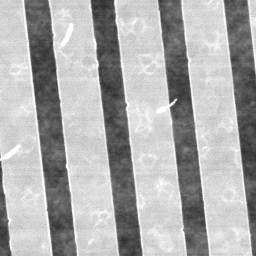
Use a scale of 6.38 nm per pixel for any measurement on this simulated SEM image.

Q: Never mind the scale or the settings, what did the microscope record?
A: one or a few lines or trenches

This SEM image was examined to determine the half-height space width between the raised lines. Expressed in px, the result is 24.6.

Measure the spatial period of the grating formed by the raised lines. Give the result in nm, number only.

421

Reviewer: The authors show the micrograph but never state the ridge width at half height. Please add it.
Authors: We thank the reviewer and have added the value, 263 nm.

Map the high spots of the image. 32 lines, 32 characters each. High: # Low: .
###...#####...######...#####...#
###...#####....#####...#####...#
###...######...#####...#####...#
###....#####...#####...#####...#
###....#####...#####...#####....
####...#####...#####...######...
####...#####...#####...######...
####...#####...#####....#####...
####...#####...######...#####...
####...#####...######...#####...
####...#####....#####...#####...
####...######...#####...#####...
####....#####...#####...#####...
####....#####...#####...#####...
####....#####...#####...######..
#####...#####...#####...######..
#####...#####...#####....#####..
#####...#####...######...#####..
#####...#####...######...#####..
#####...#####....#####...#####..
#####...######...#####...#####..
#####...######...#####...#####..
#####....#####...#####...#####..
#####....#####...#####...######.
.#####...#####...######..######.
.#####...#####...######...#####.
.#####...#####...######...#####.
.#####...#####...######...#####.
.#####...#####....#####...#####.
.#####...######...#####...#####.
.#####....#####...#####...#####.
.#####....#####...#####...#####.